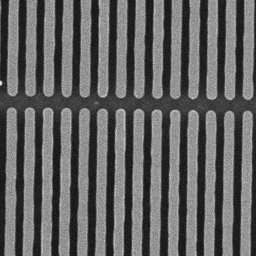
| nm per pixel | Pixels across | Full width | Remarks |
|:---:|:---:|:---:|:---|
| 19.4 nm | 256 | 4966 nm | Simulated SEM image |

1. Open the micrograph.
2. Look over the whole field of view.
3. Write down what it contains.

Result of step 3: groups of lines, slits or small figures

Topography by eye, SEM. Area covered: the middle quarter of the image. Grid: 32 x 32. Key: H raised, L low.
HHLLHHHLLHHLLHHLLLHHLLHHHLLHHLLH
HHLLHHLLLHHLLHHLLLHHLLHHHLLHHLLH
HHLLHHHLLHHLLHHLLLHHLLHHLLLHHLLH
HHLLHHHLLHHLLHHLLLHHLLHHLLLHHLLH
HHLLHHHLLHHLLHHLLLHHLLHHLLLHHLLH
HHLLHHLLLHHLLHHLLLHHLLHHLLLHHLLH
HHLLHHLLLHHLLHHLLLHHLLHHLLLHHLLH
HHLLHHLLLHHLLHHLLLHHLLHHHLLHHLLH
LLLLLLLLLLLLLLLLLLLLLLLLLLLHLLLL
LLLLLLLLLLLLLLLLLLLLLLLLLLLLLLLL
LLLLLLLLLLLLLLLLLLLLLLLLLLLLLLLL
HHLLHHLLLHLLLLHLLLHLLLLHLLLLLLLL
HHLLHHLLHHHLLHHLLLHHLLHHLLLHHLLH
HHLLHHLLHHHLLHHLLLHHLLHHLLLHHLLH
HHLLHHLLHHHLLHHLLLHHLLHHLLLHHLLH
HHLLHHLLHHHLLHHLLLHHLLHHLLLHHLLH
HHLLHHLLLHHLLHHLLLHHLLHHLLLHHLLH
HHLLHHLLHHHLLHHLLLHHLLHHLLLHHLLH
HHLLHHLLHHHLLHHLLLHHLLHHLLLHHLLH
HHLLHHLLHHHLLHHLLLHHLLHHLLLHHLLH
HHLLHHLLHHHLLHHLLLHHLLHHLLLHHLLH
HHLLHHLLHHHLLHHLLLHHLLHHLLLHHLLH
HHLLHHLLHHHLLHHLLLHHLLHHLLLHHLLH
HHLLHHLLHHHLLHHLLLHHLLHHLLLHHLLH
HHLLHHLLHHHLLHHLLLHHLLHHLLLHHLLH
HHLLHHLLHHHLLHHLLHHHLLHHLLLHHLLH
HHLLHHLLHHHLLHHLLHHHLLHHLLHHHLLH
HHLLHHLLHHLLLHHLLHHHLLHHLLHHHLLH
HHLLHHLLHHLLLHHLLHHHLLHHLLHHHLLH
HHLLHHLLHHLLLHHLLHHHLLHHLLHHHLLH
HHLLHHLLHHLLLHHLLHHHLLHHLLHHLLLH
HLLLHHLLHHLLLHHLLHHHLLHHLLHHLLLH